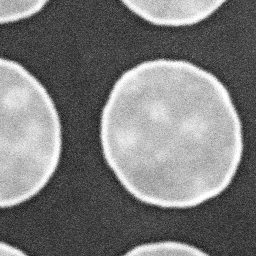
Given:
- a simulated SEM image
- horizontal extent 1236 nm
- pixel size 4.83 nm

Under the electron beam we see raised bodies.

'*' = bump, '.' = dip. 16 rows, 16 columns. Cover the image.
**......*****...
................
................
................
**......*****...
***....*******..
***....*******..
****..*********.
****..*********.
****...********.
***....********.
***.....******..
*........****...
................
................
*........***....